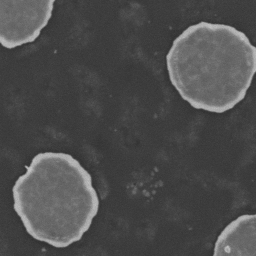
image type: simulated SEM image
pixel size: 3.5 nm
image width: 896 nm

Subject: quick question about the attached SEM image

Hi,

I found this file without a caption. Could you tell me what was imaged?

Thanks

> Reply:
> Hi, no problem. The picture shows raised bodies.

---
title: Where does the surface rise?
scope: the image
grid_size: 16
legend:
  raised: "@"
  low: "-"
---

@@@-------------
@@@-------------
@@---------@@@@-
-----------@@@@@
-----------@@@@@
-----------@@@@-
------------@@@-
----------------
----------------
----------------
--@@@-----------
-@@@@@----------
-@@@@@----------
-@@@@@----------
--@@@---------@@
-------------@@@